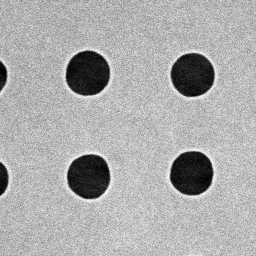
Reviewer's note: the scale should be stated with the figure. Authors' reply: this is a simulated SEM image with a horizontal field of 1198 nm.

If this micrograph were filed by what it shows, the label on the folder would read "holes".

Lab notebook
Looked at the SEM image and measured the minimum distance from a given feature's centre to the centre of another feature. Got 472 nm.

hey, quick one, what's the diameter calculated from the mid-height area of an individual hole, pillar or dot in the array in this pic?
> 207 nm